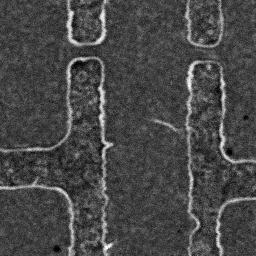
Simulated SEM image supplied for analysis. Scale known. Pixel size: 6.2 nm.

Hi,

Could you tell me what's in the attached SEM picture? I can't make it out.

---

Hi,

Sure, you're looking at one or a few lines or trenches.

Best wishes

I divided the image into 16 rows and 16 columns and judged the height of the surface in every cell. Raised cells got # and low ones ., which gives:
....###.....##..
....###.....##..
.....#......##..
................
....##......##..
....##......##..
....##......##..
....##......##..
....##......##..
#######.....##..
#######.....####
######......####
....###.....###.
....##......##..
....###.....##..
....###.....##..